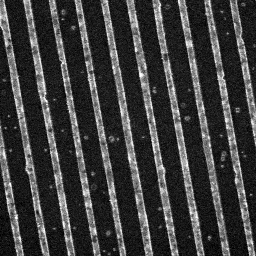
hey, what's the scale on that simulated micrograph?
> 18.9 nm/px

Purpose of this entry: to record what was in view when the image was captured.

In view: parallel lines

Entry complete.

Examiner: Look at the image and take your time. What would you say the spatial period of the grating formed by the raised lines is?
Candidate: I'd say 481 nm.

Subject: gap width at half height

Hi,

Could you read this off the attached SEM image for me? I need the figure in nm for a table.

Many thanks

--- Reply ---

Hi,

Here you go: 357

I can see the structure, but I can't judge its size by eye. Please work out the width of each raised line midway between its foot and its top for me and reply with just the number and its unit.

124 nanometres